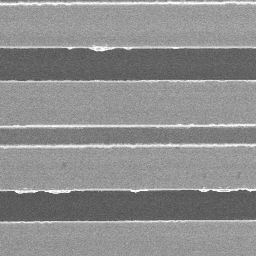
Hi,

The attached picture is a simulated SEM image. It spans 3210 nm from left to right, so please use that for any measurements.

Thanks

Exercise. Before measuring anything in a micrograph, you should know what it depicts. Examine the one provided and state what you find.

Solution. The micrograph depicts lines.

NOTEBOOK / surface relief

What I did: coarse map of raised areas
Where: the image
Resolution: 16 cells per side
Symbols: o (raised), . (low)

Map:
oooooooooooooooo
oooooooooooooooo
oooooooooooooooo
................
................
oooooooooooooooo
oooooooooooooooo
oooooooooooooooo
oooooooooooooooo
oooooooooooooooo
oooooooooooooooo
oooooooooooooooo
................
................
oooooooooooooooo
oooooooooooooooo